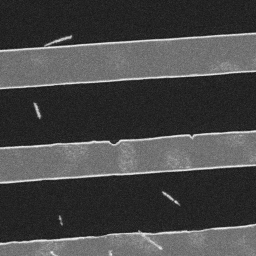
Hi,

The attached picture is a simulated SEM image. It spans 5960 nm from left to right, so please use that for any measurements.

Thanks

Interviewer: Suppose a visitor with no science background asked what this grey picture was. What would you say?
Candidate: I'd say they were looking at one or a few lines or trenches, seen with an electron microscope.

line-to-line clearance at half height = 1.41 µm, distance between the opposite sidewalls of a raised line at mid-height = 0.829 µm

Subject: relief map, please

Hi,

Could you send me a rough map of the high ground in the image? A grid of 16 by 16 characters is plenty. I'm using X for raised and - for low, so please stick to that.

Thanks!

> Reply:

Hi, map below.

----------------
----------------
----------XXXXXX
XXXXXXXXXXXXXXXX
XXXXXXXXXXXXXXX-
----------------
----------------
----------------
-----------XXXXX
XXXXXXXXXXXXXXXX
XXXXXXXXXXXXX---
----------------
----------------
----------------
-----------XXXXX
XXXXXXXXXXXXXXXX